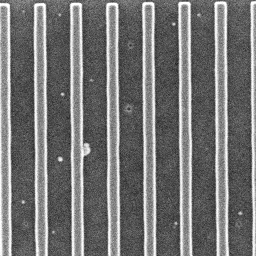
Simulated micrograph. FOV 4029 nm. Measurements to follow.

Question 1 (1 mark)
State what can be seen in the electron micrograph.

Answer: groups of lines, slits or small figures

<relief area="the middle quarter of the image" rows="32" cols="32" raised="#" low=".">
..##.......##.......##.......##.
..##.......##.......##.......##.
..##.......##.......##.......##.
..##.......##.......##.......##.
..##.......##.......##.......###
..##.......##.......##.......###
..##.......##.......##.......###
..##.......##.......##.......###
..##.......##.......##.......###
..##.......##.......##.......###
..##.......##.......##.......###
..##.......##.......##.......###
..##.......###......##.......###
..##.......###......##.......###
..##.......###......##.......###
..##.......###......##.......###
..##.......###......##.......###
..##.......###......##.......###
..##.......###......##.......###
..##.......###......###......###
..##.......###......###......###
..##.......##.......###......###
..##.......##.......###......###
..##.......###......###......###
..##.......###......###......###
..##.......###......###......###
..##.......###......###......###
..##.......###......###......###
..##.......###......###......###
..##.......###......###......###
..##.......###......###......###
..##.......###......###......###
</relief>